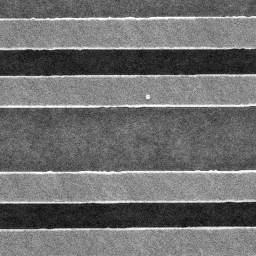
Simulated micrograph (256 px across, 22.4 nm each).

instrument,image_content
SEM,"lines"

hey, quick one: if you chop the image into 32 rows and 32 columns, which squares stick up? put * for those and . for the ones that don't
................................
................................
********************************
********************************
********************************
********************************
................................
................................
................................
......**************************
********************************
********************************
********************************
................................
................................
................................
................................
................................
................................
................................
................................
......*...**.*******************
********************************
********************************
********************************
................................
................................
................................
.......................*********
********************************
********************************
********************************